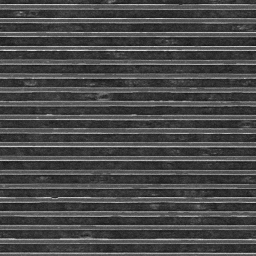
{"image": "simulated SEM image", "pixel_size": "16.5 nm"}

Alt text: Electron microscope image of parallel lines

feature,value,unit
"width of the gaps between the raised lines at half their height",157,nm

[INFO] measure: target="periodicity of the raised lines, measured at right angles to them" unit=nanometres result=228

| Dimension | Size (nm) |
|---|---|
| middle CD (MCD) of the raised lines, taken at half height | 72.3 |